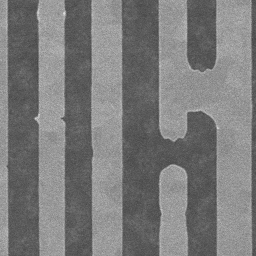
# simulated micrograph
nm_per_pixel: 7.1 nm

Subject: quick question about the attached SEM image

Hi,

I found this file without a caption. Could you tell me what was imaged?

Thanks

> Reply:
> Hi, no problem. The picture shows one or a few lines or trenches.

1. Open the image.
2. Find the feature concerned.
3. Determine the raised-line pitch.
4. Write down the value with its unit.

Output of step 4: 0.43 µm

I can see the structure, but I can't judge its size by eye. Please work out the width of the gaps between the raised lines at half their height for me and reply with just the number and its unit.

221 nm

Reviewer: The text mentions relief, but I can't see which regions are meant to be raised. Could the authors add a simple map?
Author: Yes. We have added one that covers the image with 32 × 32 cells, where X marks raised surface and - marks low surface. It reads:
X----XXX----XXX-X---XXX----XXXX-
X----XXX----XXX-----XXX----XXXX-
X----XXX----XXX-----XXX----XXXX-
X----XXX----XXX-----XXX----XXXX-
X----XXX----XXX-----XXX----XXXX-
X----XXX----XXX-----XXX----XXXX-
X----XXX----XXX-----XXX----XXXX-
X----XXX----XXX-----XXX----XXXX-
X----XXX----XXX-----XXXX---XXXX-
X----XXX----XXX-----XXXXXXXXXXX-
X----XXX---XXXX-----XXXXXXXXXXX-
X----XXX---XXXX-----XXXXXXXXXXX-
X----XXX---XXXX-----XXXXXXXXXXX-
X----XXX---XXXX-----XXXXXXXXXXX-
X----XXX----XXX-----XXX---XXXXX-
X----XXX----XXX-----XXX----XXXX-
X----XXX----XXX-----XXX----XXXX-
X----XXX----XXX------X-----XXXX-
X----XXX----XXX------------XXXX-
X----XXX----XXX------------XXXX-
X----XXX----XXX------------XXXX-
X----XXX----XXX-----XXX----XXXX-
X----XXX----XXX-----XXX----XXXX-
X----XXX----XXX-----XXX----XXXX-
X----XXX----XXX-----XXX----XXXX-
X----XXX----XXX-----XXX----XXXX-
X----XXX----XXX-----XXX----XXXX-
X----XXX----XXX-----XXX----XXXX-
X----XXX----XXX-----XXX----XXXX-
X----XXX-X--XXX-----XXX----XXXX-
X----XXX----XXX-----XXX----XXXX-
X----XXX----XXX-----XXX----XXXX-